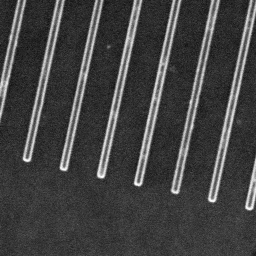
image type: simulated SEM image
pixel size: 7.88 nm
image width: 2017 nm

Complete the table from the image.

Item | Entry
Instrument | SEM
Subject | parallel lines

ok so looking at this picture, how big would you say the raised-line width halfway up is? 6.84 pixels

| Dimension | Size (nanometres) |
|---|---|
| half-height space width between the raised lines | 250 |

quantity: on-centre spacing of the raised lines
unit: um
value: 0.299